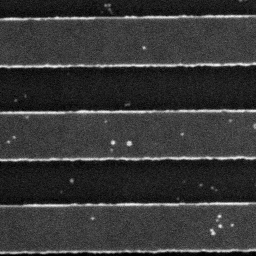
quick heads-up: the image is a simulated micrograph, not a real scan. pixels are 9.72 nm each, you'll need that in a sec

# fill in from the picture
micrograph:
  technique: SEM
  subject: lines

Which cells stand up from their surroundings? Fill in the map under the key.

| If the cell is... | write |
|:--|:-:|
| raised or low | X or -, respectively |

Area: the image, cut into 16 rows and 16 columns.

----------------
XXXXXXXXXXXXXXXX
XXXXXXXXXXXXXXXX
XXXXXXXXXXXXXXXX
----------------
----------------
----------------
XXXXXXXXXXXXXXXX
XXXXXXXXXXXXXXXX
XXXXXXXXXXXXXXXX
----------------
----------------
----------------
XXXXXXXXXXXXXXXX
XXXXXXXXXXXXXXXX
XXXXXXXXXXXXXXXX